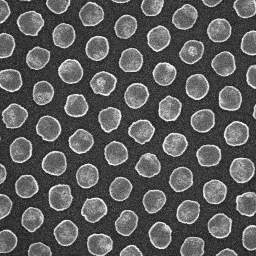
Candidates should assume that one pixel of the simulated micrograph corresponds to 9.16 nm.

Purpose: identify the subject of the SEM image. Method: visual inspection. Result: a regular array of raised bodies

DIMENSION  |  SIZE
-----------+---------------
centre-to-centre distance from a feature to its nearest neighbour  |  0.315 microns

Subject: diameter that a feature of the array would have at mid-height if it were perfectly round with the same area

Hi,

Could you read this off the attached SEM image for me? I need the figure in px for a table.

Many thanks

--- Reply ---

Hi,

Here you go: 23.6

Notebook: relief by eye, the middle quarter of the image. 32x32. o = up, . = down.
oooo..........ooooo....oooo.....
ooooo..........ooo.....ooooo....
ooooo...ooo...........oooooo....
oooo...oooooo..........ooooo...o
.oo....oooooo..........oooo....o
.......oooooo....ooo...........o
.......ooooo....ooooo..........o
.........oo....oooooo..........o
.oooo..........oooooo....ooo....
.ooooo..........oooo....ooooo...
oooooo..........ooo.....ooooo...
oooooo....ooo...........ooooo...
.oooo....ooooo..........ooooo...
.........ooooo..........oooo....
.........ooooo....ooo...........
.........oooo....ooooo..........
....o.....oo....ooooooo.........
...ooo..........oooooo....ooo...
.oooooo..........ooooo...ooooo..
.oooooo.....o......o.....oooooo.
..ooooo....oooo..........oooooo.
..oooo....oooooo.........ooooo..
..........oooooo....oo....ooo...
...........ooooo...oooo.........
...........oooo....ooooo........
.....oo...........oooooo........
....oooo..........oooooo....ooo.
...ooooo...........oooo....ooooo
...ooooo.....oo............ooooo
....oooo....oooo..........oooooo
o...ooo.....ooooo..........ooooo
o..........oooooo...........oo..